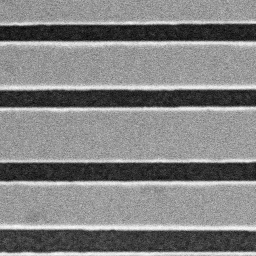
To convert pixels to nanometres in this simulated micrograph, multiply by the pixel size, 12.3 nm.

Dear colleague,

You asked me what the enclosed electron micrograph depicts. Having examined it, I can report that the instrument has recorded lines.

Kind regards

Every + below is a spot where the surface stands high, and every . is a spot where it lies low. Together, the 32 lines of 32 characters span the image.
++++++++++++++++++++++++++++++++
++++++++++++++++++++++++++++++++
++++++++++++++++++++++++++++++++
................................
................................
++++++++++++++++++++++++++++++++
++++++++++++++++++++++++++++++++
++++++++++++++++++++++++++++++++
++++++++++++++++++++++++++++++++
++++++++++++++++++++++++++++++++
++++++++++++++++++++++++++++++++
................................
................................
.+++++..++.+++++++++++++++++++++
++++++++++++++++++++++++++++++++
++++++++++++++++++++++++++++++++
++++++++++++++++++++++++++++++++
++++++++++++++++++++++++++++++++
++++++++++++++++++++++++++++++++
++++++++++++++++++++++++++++++++
................................
................................
................................
++++++++++++++++++++++++++++++++
++++++++++++++++++++++++++++++++
++++++++++++++++++++++++++++++++
++++++++++++++++++++++++++++++++
++++++++++++++++++++++++++++++++
++++++++++++++++++++++++++++++++
................................
................................
................................